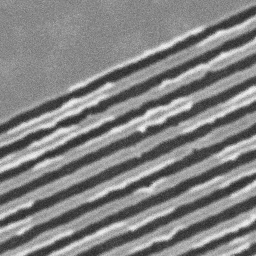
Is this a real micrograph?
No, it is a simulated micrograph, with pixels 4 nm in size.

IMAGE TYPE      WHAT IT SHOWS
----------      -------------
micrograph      parallel lines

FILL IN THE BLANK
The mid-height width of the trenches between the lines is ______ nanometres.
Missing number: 39.5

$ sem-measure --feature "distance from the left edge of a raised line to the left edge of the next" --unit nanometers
86.5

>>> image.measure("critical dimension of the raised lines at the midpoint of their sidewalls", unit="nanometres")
46.7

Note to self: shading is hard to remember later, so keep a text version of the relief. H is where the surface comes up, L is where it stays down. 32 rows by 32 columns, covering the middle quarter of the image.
HHHHHHHHHHHHHHHLLLLLLHHHHHHHLLLL
HHHHHHHHHHHHLLLLLLLHHHHHHHLLLLLH
HHHHHHHHHHLLLLLLLHHHHHHHLLLLLLHH
HHHHHHHHHLLLLLLHHHHHHLLLLLLLHHHH
HHHHHHHLLLLLLHHHHHHLLLLLLHHHHHHH
HHHHHLLLLLHHHHHHHLLLLLLLHHHHHLLL
HHHLLLLLHHHHHHHLLLLLLLHHHHHLLLLL
LLLLLLHHHHHHHLLLLLLLHHHHHLLLLLLL
LLLLHHHHHHHLLLLLLLHHHHHLLLLLLHHH
LHHHHHHHHLLLLLLHHHHHLLLLLLLHHHHH
HHHHHHHLLLLLLHHHHHHLLLLLLLHHHHHH
HHHHHLLLLLLHHHHHLLLLLHHHHHHHHHHL
HHHLLLLLLHHHHHHLLLLLHHHHHHHHLLLL
LLLLLLHHHHHHHLLLLLHHHHHHHHLLLLLL
LLLLHHHHHHLLLLLLHHHHHHHHHLLLLLHH
LLHHHHHHHLLLLLHHHHHHHLLLLLLLHHHH
HHHHHHLLLLLLHHHHHHHHLLLLLHHHHHHH
HHHHLLLLLLHHHHHHLLLLLLLHHHHHHLLL
HHLLLLLLHHHHHHLLLLLLLHHHHHHLLLLL
LLLLLLHHHHHHLLLLLLLHHHHHLLLLLLLL
LLLLHHHHHHLLLLLLLLHHHHHLLLLLLLHH
LLHHHHHHLLLLLLHHHHHHHLLLLLLHHHHH
HHHHHHLLLLLLLHHHHHHLLLLLLLHHHHHL
HHHLLLLLLLLHHHHHHLLLLLLLHHHHHHLL
HLLLLLLLHHHHHHLLLLLLLHHHHHHLLLLL
LLLLLLHHHHHHLLLLLLLHHHHHHLLLLLLL
LLLLHHHHHHLLLLLLLHHHHHHHLLLLLLHH
LLHHHHHHLLLLLLLHHHHHHHLLLLLLHHHH
HHHHHHLLLLLLLHHHHHHLLLLLLHHHHHHL
HHHLLLLLLLLHHHHHHLLLLLLHHHHHHLLL
HLLLLLLLHHHHHHHLLLLLLLHHHHHHLLLL
LLLLLLHHHHHHLLLLLLHHHHHHHLLLLLLH